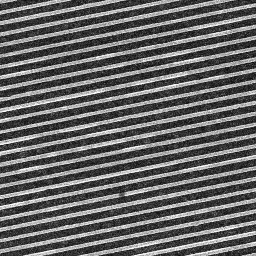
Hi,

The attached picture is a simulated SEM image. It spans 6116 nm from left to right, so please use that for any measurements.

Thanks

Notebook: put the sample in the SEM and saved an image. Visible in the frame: parallel lines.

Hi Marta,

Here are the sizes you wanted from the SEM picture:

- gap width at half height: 6.99 pixels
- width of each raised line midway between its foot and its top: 0.0821 um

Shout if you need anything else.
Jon